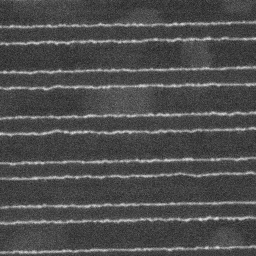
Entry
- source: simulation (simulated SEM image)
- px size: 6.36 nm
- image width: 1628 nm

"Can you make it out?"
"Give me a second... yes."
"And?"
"lines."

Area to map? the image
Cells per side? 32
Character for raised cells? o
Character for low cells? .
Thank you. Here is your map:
................................
................................
................................
oooooooooooooooooooooooooooooooo
oooooooooooooooooooooooooooooooo
o...............................
................................
................................
.............................ooo
oooooooooooooooooooooooooooooooo
oooooooooooooooooooooooooooooooo
................................
................................
................................
...........o.ooooooooooooooooooo
oooooooooooooooooooooooooooooooo
ooooooo.ooooooooo.oo............
................................
................................
................................
oooooooooooooooooooooooooooooooo
oooooooooooooooooooooooooooooooo
................................
................................
................................
.....................ooooooooooo
oooooooooooooooooooooooooooooooo
ooooooooooooooooo.o....o........
................................
................................
................................
.ooooooooooooooooooooooooooooooo